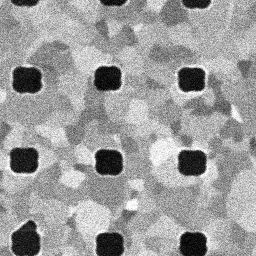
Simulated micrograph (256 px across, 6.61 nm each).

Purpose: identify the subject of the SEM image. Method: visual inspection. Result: holes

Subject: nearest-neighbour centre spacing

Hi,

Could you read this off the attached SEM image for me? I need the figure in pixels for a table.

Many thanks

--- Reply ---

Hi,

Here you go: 81.8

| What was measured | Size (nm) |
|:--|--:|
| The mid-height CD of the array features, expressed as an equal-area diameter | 196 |